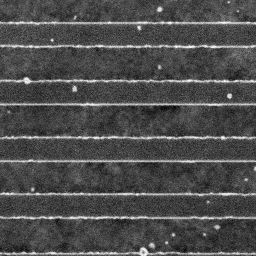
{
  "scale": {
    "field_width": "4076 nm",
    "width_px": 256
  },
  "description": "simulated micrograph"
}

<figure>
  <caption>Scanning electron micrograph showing lines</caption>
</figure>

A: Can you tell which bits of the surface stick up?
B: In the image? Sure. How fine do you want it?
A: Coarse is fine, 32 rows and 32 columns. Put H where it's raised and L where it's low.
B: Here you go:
LLLLLLLLLLLLLLLLLLLLLLLLLLLLLLLL
LLLLLLLLLLLLLLLLLLLLLLLLLLLLLLLL
LLLLLLLLLLLLLLLLLLLLLLLLLLLLLLLL
HHHHHHHHHHHHHHHHHHHHHHHHHHHHHHHH
HHHHHHHHHHHHHHHHHHHHHHHHHHHHHHHH
HHHHHHHHHHHHHHHHHHHHHHHHHHHHHHHH
LLLLLLLLLLLLLLLLLLLLLLLLLLLLLLLL
LLLLLLLLLLLLLLLLLLLLLLLLLLLLLLLL
LLLLLLLLLLLLLLLLLLLLLLLLLLLLLLLL
LLLLLLLLLLLLLLLLLLLLLLLLLLLLLLLL
HHHHHHHHHHHHHHHHHHHHHHHHHHHHHHHH
HHHHHHHHHHHHHHHHHHHHHHHHHHHHHHHH
HHHHHHHHHHHHHHHHHHHHHHHHHHHHHHHH
LLLLLLLLLLLLLLLLLLLLLLLLLLLLLLLL
LLLLLLLLLLLLLLLLLLLLLLLLLLLLLLLL
LLLLLLLLLLLLLLLLLLLLLLLLLLLLLLLL
LLLLLLLLLLLLLLLLLLLLLLLLLLLLLLLL
HHHHHHHHHHHHHHHHHHHHHHHHHHHHHHHH
HHHHHHHHHHHHHHHHHHHHHHHHHHHHHHHH
HHHHHHHHHHHHHHHHHHHHHHHHHHHHHHHH
LLLLLLLLLLLLLLLLLLLLLLLLLLLLLLLL
LLLLLLLLLLLLLLLLLLLLLLLLLLLLLLLL
LLLLLLLLLLLLLLLLLLLLLLLLLLLLLLLL
LLLLLLLLLLLLLLLLLLLLLLLLLLLLLLLL
HHHHHHHHHHHHHHHHHHHHHHHHHHHHHHHH
HHHHHHHHHHHHHHHHHHHHHHHHHHHHHHHH
HHHHHHHHHHHHHHHHHHHHHHHHHHHHHHHH
LLLLLLLLLLLLLLLLLLLLLLLLLLLLLLLL
LLLLLLLLLLLLLLLLLLLLLLLLLLLLLLLL
LLLLLLLLLLLLLLLLLLLLLLLLLLLLLLLL
LLLLLLLLLLLLLLLLLLLLLLLLLLLLLLLL
LLLLLLLLLLLLLLLLLHHLLLLLLLLLLLLL